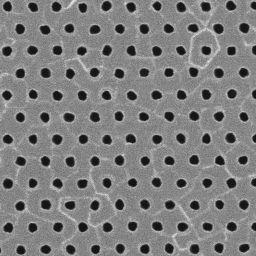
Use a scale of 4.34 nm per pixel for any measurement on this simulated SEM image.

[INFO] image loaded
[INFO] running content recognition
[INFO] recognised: a regular array of holes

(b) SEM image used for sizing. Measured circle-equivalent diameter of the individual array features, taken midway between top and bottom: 39.4 nm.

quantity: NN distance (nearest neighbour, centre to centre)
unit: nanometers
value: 106